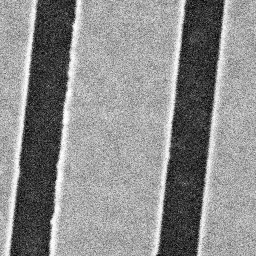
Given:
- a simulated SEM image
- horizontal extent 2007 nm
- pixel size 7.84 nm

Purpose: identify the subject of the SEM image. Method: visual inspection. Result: one or a few lines or trenches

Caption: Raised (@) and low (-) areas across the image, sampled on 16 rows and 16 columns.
@@---@@@@@@---@@
@@---@@@@@@---@@
@@---@@@@@@---@@
@@--@@@@@@@---@@
@@--@@@@@@@---@@
@@--@@@@@@@---@@
@@--@@@@@@@--@@@
@---@@@@@@@--@@@
@---@@@@@@@--@@@
@---@@@@@@@--@@@
@---@@@@@@---@@@
@---@@@@@@---@@@
@--@@@@@@@---@@@
@--@@@@@@@---@@@
@--@@@@@@@---@@@
@--@@@@@@@--@@@@